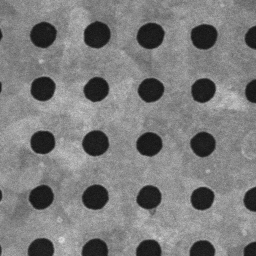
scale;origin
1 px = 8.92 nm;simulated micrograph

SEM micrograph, a regular array of holes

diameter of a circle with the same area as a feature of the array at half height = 235 nm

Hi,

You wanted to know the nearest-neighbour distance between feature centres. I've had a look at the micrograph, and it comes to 477 nanometers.